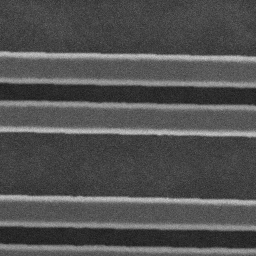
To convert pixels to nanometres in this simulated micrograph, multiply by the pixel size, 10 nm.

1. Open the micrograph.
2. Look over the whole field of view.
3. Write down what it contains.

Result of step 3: lines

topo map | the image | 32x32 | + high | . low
................................
................................
................................
................................
................................
................................
................................
++++++++++++++++++++++++++++++++
++++++++++++++++++++++++++++++++
++++++++++++++++++++++++++++++++
............++++++++++++++++++++
................................
................................
++++++++++++++++++++++++++++++++
++++++++++++++++++++++++++++++++
++++++++++++++++++++++++++++++++
........++++++++++++++++++++++++
................................
................................
................................
................................
................................
................................
................................
................................
++++++++++++++++++++++++++++++++
++++++++++++++++++++++++++++++++
++++++++++++++++++++++++++++++++
......................++++++++++
................................
................................
++++++++++++++++++++++++++++++++